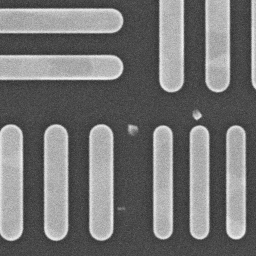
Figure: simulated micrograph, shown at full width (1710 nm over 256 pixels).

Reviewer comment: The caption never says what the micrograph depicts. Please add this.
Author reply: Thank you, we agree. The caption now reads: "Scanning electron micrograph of groups of lines, slits or small figures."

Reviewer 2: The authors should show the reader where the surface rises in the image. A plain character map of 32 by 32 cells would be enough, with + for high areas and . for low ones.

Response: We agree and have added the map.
....................+++...+++...
+++++++++++++++.....+++...+++...
+++++++++++++++.....+++...+++...
+++++++++++++++.....+++...+++...
....................+++...+++...
....................+++...+++...
....................+++...+++...
+++++++++++++++.....+++...+++...
+++++++++++++++.....+++...+++...
+++++++++++++++.....+++...+++...
....................+++...+++...
................................
................................
................................
........................+.......
................................
+++...++...+++..+..++...++..+++.
+++...++...+++.....++...++..+++.
+++...++...+++.....++...++..+++.
+++...++...+++.....++...++..+++.
+++...++...+++.....++...++..+++.
+++...++...+++.....++...++..+++.
+++...++...+++.....++...++..+++.
+++...++...+++.....++...++..+++.
+++...++...+++.....++...++..+++.
+++...++...+++.....++...++..+++.
+++...++...+++.....++...++..+++.
+++...++...+++.....++...++..+++.
+++...++...+++.....++...++..+++.
++....++....++......+...++...+..
................................
................................